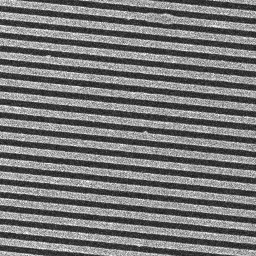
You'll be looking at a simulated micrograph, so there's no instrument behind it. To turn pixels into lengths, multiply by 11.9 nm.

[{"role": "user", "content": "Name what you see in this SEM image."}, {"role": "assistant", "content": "parallel lines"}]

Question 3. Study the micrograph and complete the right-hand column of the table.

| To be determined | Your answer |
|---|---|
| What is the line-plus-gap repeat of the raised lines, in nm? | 158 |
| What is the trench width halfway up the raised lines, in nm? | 74.2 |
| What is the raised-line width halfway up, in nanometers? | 83.1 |